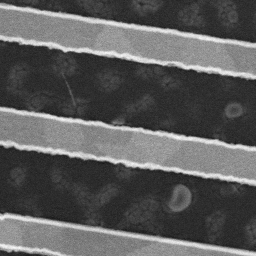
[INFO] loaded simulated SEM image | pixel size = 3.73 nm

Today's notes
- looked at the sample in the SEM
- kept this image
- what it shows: one or a few lines or trenches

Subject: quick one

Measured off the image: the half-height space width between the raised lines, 265 nm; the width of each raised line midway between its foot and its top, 120 nanometres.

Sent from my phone